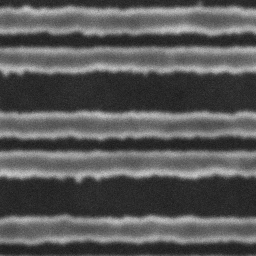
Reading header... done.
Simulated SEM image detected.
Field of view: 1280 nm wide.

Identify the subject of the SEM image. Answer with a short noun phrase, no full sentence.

lines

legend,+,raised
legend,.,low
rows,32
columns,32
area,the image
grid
................................
++++++++++++++++++++++++++++++++
++++++++++++++++++++++++++++++++
++++++++++++++++++++++++++++++++
................................
................................
++++++++++++++++++++++++++++++++
++++++++++++++++++++++++++++++++
++++++++++++++++++++++++++++++++
................................
................................
................................
................................
................................
++++++++++++++++++++++++++++++++
++++++++++++++++++++++++++++++++
++++++++++++++++++++++++++++++++
................................
................................
++++++++++++++++++++++++++++++++
++++++++++++++++++++++++++++++++
++++++++++++++++++++++++++++++++
................................
................................
................................
................................
................................
++++++++++++++++++++++++++++++++
++++++++++++++++++++++++++++++++
++++++++++++++++++++++++++++++++
...++...........................
................................